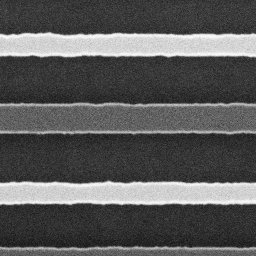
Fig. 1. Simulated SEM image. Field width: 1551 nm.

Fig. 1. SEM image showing lines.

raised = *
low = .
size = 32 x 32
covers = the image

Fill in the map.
................................
................................
................................
................................
********..************..********
********************************
********************************
................................
................................
................................
................................
................................
................................
********************************
********************************
********************************
**********.***********.*.*******
................................
................................
................................
................................
................................
................................
********************************
********************************
................................
................................
................................
................................
................................
................................
********************************